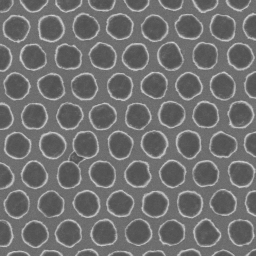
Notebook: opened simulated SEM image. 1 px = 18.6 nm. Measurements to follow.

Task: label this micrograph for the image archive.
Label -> a regular array of raised bodies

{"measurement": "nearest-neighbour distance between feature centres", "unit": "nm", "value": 619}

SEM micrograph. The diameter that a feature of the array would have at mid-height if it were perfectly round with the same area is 484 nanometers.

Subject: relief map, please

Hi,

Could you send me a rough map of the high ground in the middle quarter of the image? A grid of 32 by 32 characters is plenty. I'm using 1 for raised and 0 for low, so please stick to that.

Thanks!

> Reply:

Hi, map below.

11110000111100001111000001111000
00000000000000000000000000000000
00000000000000000000011110000011
00011110000011110000111110000111
00111111000111111001111111001111
00111111000111111001111111001111
00111111000111111000111111001111
00111111000111111000111110000111
00001110000011110000000100000011
00000000000000000000000000110000
11100000111000001111000011111000
11110001111110001111100011111100
11111011111110011111110011111100
11110011111110011111110011111100
11110001111100001111100011111000
11100001111100001111000000110000
00000000000000000000000000000000
00011110000011110000111110000111
00011111000111111000111110001111
00111111000111111001111111001111
00111111000111111001111111001111
00011111000111111000111110000111
00111111000011110000011110000111
01111000000001100000000000000001
01110000111000000111000000110000
11110001111100001111100001111100
11110001111110011111100011111100
11110001111110011111100011111100
11110001111110011111110011111100
11110000111100001111100001111100
11100000011100000111000000110000
00000000000000000000000000000000